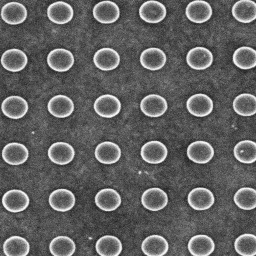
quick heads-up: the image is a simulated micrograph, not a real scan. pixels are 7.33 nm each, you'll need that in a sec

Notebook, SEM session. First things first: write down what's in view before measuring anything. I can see a regular array of raised bodies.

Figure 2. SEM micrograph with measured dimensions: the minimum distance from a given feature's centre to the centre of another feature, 338 nm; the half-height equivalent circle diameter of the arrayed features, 172 nm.